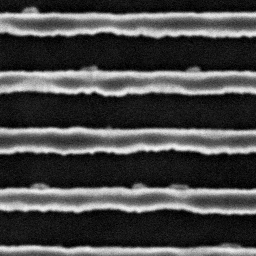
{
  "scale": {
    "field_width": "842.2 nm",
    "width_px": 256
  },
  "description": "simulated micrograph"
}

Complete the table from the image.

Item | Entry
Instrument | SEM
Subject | lines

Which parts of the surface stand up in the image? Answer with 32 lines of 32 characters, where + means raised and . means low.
................................
................................
++++++++++++++++++++++++++++++++
++++++++++++++++++++++++++++++++
................................
................................
................................
................................
................................
++++++++++++++++++++++++++++++++
++++++++++++++++++++++++++++++++
........++..++++.......+++++....
................................
................................
................................
................................
++++++++++++++++++++++++++++++++
++++++++++++++++++++++++++++++++
+++++++++++++++++++++.++++++++++
................................
................................
................................
................................
................................
++++++++++++++++++++++++++++++++
++++++++++++++++++++++++++++++++
.........................+.+++++
................................
................................
................................
................................
++++++++++++++++++++++++++++++++